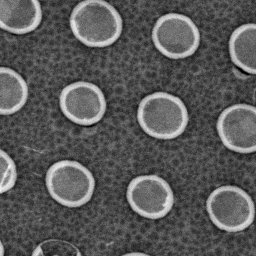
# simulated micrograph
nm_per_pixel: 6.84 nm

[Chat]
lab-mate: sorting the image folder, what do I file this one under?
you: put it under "raised bodies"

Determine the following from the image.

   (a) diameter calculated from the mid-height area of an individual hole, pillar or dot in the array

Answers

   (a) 0.289 micrometres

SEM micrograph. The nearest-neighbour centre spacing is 554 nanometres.